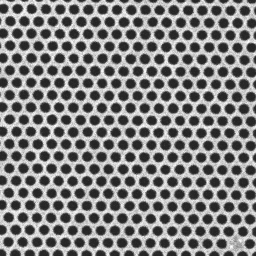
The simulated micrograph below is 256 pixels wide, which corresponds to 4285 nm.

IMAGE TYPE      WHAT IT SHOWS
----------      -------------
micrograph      a regular array of holes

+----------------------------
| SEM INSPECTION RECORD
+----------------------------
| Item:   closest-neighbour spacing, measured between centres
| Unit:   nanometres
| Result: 234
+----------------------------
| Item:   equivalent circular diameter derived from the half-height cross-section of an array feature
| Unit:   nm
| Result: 184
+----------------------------